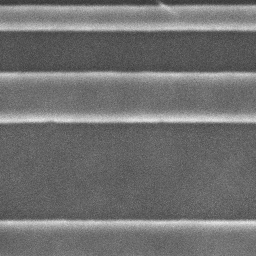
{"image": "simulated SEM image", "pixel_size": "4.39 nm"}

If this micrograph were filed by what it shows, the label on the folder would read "lines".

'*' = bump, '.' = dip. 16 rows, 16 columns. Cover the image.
****************
****************
................
................
................
****************
****************
****************
................
................
................
................
................
................
****************
****************